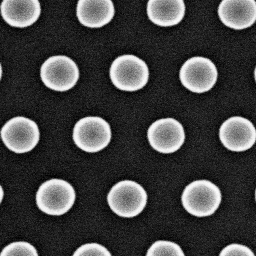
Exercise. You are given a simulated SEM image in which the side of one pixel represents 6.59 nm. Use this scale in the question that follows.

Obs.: a regular array of raised bodies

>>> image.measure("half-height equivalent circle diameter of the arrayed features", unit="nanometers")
232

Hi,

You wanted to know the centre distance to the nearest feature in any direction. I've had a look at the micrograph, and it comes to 0.457 um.